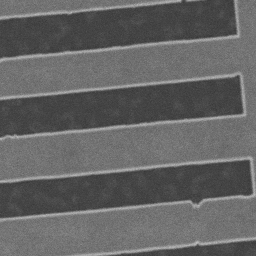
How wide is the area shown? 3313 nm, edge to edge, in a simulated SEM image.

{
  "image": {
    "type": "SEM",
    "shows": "one or a few lines or trenches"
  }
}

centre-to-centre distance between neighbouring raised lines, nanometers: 1050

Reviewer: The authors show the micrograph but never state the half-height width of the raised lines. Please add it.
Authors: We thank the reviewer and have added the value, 563 nanometres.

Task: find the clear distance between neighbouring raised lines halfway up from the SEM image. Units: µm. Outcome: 0.505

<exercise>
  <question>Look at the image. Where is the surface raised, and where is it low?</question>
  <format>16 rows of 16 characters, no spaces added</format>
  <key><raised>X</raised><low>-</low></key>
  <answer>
XXXXXXX--------X
---------------X
------------XXXX
--XXXXXXXXXXXXXX
XXXXXXXXXXXXXXXX
XXXXXXX--------X
---------------X
------------XXXX
--XXXXXXXXXXXXXX
XXXXXXXXXXXXXXXX
XXXXXXXXX-------
----------------
-------------XXX
--XXXXXXXXXXXXXX
XXXXXXXXXXXXXXXX
XXXXXXXXXX------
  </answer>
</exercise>